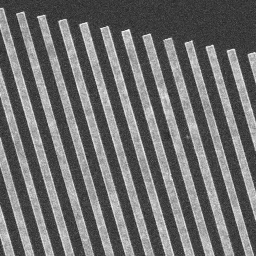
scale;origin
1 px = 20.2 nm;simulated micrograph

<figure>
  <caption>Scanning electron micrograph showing parallel lines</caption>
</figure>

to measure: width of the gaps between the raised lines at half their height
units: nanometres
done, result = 233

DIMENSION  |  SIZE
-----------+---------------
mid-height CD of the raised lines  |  150 nm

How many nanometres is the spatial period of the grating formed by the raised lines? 390